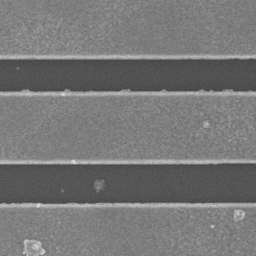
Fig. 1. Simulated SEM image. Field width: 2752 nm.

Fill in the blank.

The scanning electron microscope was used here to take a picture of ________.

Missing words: lines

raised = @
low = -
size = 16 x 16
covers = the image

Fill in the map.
@@@@@@@@@@@@@@@@
@@@@@@@@@@@@@@@@
@@@@@@@@@@@@@@@@
@@@@@@@@@@@@@@@@
----------------
----------------
@@@@@@@@@@@@@@@@
@@@@@@@@@@@@@@@@
@@@@@@@@@@@@@@@@
@@@@@@@@@@@@@@@@
----------------
----------------
----------------
@@@@@@@@@@@@@@@@
@@@@@@@@@@@@@@@@
@@@@@@@@@@@@@@@@